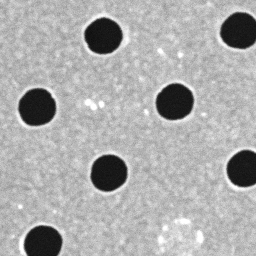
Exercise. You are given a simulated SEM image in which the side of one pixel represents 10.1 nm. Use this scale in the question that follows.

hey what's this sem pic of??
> holes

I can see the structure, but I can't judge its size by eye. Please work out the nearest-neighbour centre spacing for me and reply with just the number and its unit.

976 nm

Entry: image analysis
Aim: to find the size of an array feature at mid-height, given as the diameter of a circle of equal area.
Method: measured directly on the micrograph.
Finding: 384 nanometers